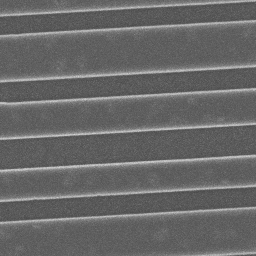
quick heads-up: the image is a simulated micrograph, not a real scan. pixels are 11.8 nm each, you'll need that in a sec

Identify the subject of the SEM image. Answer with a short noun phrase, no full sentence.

parallel lines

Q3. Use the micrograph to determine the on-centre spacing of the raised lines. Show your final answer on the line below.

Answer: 63.3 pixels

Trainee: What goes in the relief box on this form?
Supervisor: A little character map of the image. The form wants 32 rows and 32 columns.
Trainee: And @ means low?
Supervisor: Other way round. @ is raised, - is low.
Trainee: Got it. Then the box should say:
@@@@@@@@@@@@@@@@@@@@@@@@--------
@@@@@@@-------------------------
--------------------------------
-----------------@@@@@@@@@@@@@@@
@@@@@@@@@@@@@@@@@@@@@@@@@@@@@@@@
@@@@@@@@@@@@@@@@@@@@@@@@@@@@@@@@
@@@@@@@@@@@@@@@@@@@@@@@@@@@@@@@@
@@@@@@@@@@@@@@@@@@@@@@@@@@@@@@@@
@@@@@@@@@@@@@@@@@@@@@@@@@@@@----
@@@@@@@@@@@---------------------
--------------------------------
---------------------------@@@@@
----------@@@@@@@@@@@@@@@@@@@@@@
@@@@@@@@@@@@@@@@@@@@@@@@@@@@@@@@
@@@@@@@@@@@@@@@@@@@@@@@@@@@@@@@@
@@@@@@@@@@@@@@@@@@@@@@@@@@@@@@@-
@@@@@@@@@@@@@@------------------
--------------------------------
--------------------------------
--------------------------------
----------------@@@@@@@@@@@@@@@@
@@@@@@@@@@@@@@@@@@@@@@@@@@@@@@@@
@@@@@@@@@@@@@@@@@@@@@@@@@@@@@@@@
@@@@@@@@@@@@@@@@@@@@@@@@@@------
@@@@@@@@@-----------------------
--------------------------------
-----------------------@@@@@@@@@
------@@@@@@@@@@@@@@@@@@@@@@@@@@
@@@@@@@@@@@@@@@@@@@@@@@@@@@@@@@@
@@@@@@@@@@@@@@@@@@@@@@@@@@@@@@@@
@@@@@@@@@@@@@@@@@@@@@@@@@@@@@@@@
@@@@@@@@@@@@@@@@@@@@@@@@@@@@@@@@